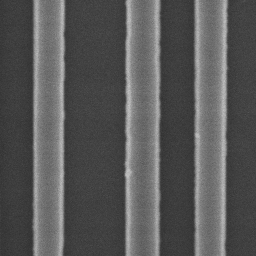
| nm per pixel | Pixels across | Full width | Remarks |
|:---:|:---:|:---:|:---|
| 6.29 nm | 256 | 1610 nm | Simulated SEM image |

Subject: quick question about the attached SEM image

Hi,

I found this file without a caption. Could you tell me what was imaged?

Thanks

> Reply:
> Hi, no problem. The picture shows lines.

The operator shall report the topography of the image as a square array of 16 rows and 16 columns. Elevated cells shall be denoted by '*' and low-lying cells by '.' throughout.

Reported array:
..**....**..**..
..**....**..**..
..**....**..**..
..**....**..**..
..**....**..**..
..**....**..**..
..**....**..**..
..**....**..**..
..**....**..**..
..**....**..**..
..**....**..**..
..**....**..**..
..**....**..**..
..**....**..**..
..**....**..**..
..**....**..**..